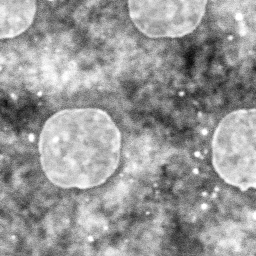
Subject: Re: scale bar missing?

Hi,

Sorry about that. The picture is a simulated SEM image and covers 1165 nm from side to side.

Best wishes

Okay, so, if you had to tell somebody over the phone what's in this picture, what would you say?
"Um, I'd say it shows raised bodies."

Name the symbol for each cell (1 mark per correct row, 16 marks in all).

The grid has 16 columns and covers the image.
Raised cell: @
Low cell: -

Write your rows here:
@@------@@@@@---
@@-------@@@----
----------------
----------------
----------------
----------------
----------------
---@@@@-------@@
---@@@@------@@@
---@@@@------@@@
---@@@@-------@@
----@@---------@
----------------
----------------
----------------
----------------